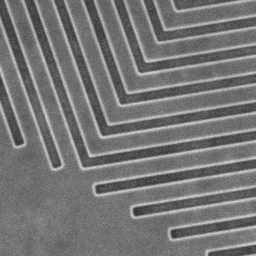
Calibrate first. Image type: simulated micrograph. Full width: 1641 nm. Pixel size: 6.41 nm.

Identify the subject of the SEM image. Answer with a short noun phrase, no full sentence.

groups of lines, slits or small figures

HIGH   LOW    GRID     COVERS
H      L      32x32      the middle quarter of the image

HHHLLLHHHHHLLHHHHHLLLLLLLLLLLLLH
HHHLLLHHHHHLLLHHHHLLLLLLLHHHHHHH
HHHHLLHHHHHLLLHHHHHLHHHHHHHHHHHH
HHHHLLLHHHHHLLHHHHHHHHHHHHHHHHHH
HHHHHLLHHHHHLLLHHHHHHHHHHHHHHHHH
HHHHHLLLHHHHLLLHHHHHHHHHHHHHLLLL
HHHHHLLLHHHHHLLHHHHHHLLLLLLLLLLL
LHHHHHLLHHHHHLLLLLLLLLLLLLLLLLLL
LHHHHHLLLHHHHLLLLLLLLLLLLLHHHHHH
LLHHHHLLLHHHHHLLLLLLHHHHHHHHHHHH
LLHHHHLLLHHHHHHHHHHHHHHHHHHHHHHH
LLHHHHHLLLHHHHHHHHHHHHHHHHHHHHHH
LLLHHHHLLLHHHHHHHHHHHHHHHHHHHLLL
LLLHHHHHLLHHHHHHHHHHHHHLLLLLLLLL
HLLHHHHHLLLHHHHLLLLLLLLLLLLLLLLL
HLLLHHHHLLLLLLLLLLLLLLLLLLLHHHHH
HLLLHHHHHLLLLLLLLLLLLHHHHHHHHHHH
HHLLHHHHHLLLLLHHHHHHHHHHHHHHHHHH
HHLLLHHHHHHHHHHHHHHHHHHHHHHHHHHH
HHLLLHHHHHHHHHHHHHHHHHHHHHHHHHLL
HHHLLHHHHHHHHHHHHHHHHHHLLLLLLLLL
HHHLLLHHHHHHHHHHHLLLLLLLLLLLLLLL
HHHLLLHHHHLLLLLLLLLLLLLLLLLHHHHH
HHHHLLLLLLLLLLLLLLLLLHHHHHHHHHHH
HHHHLLLLLLLLLLLHHHHHHHHHHHHHHHHH
HHHHLLLLLHHHHHHHHHHHHHHHHHHHHHHH
HHHHHHHHHHHHHHHHHHHHHHHHHHHHHHLL
HHHHHHHHHHHHHHHHHHHHHHHHLLLLLLLL
HHHHHHHHHHHHHHHHHHLLLLLLLLLLLLLL
HHHHHHHHHHHHLLLLLLLLLLLLLLLLLHHH
HHHHHHHHLLLLLLLLLLLLLLHHHHHHHHHH
HHHHHHHHLLLLLLLLHHHHHHHHHHHHHHHH